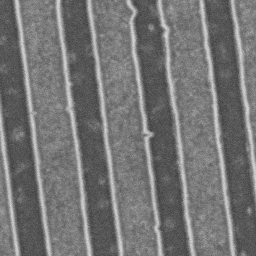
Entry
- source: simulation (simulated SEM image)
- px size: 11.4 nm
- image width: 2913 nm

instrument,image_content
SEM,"one or a few lines or trenches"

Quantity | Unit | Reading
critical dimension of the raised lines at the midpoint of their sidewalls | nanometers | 451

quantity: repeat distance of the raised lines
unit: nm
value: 812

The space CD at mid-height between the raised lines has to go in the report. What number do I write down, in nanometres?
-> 365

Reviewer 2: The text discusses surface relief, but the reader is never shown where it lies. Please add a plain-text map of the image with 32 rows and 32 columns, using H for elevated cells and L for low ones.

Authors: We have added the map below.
LLHHHHHLLLLHHHHHLLLLHHHHHLLLLHHH
LLHHHHHLLLLHHHHHHLLLHHHHHLLLLHHH
LLHHHHHLLLLHHHHHLLLLHHHHHLLLLHHH
LLLHHHHHLLLLHHHHLLLLLHHHHHLLLLHH
LLLHHHHHLLLLHHHHHLLLLHHHHHLLLLHH
LLLHHHHHLLLLHHHHHLLLLHHHHHLLLLHH
LLLHHHHHLLLLHHHHHLLLLHHHHHLLLLHH
LLLHHHHHLLLLHHHHHLLLLHHHHHLLLLHH
LLLHHHHHLLLLHHHHHLLLLHHHHHLLLLHH
LLLHHHHHLLLLHHHHHLLLLHHHHHLLLLHH
LLLHHHHHLLLLLHHHHLLLLHHHHHLLLLHH
LLLLHHHHHLLLLHHHHHLLLLHHHHHLLLLH
LLLLHHHHHLLLLHHHHHLLLLHHHHHLLLLH
LLLLHHHHHLLLLHHHHHLLLLHHHHHLLLLH
LLLLHHHHHLLLLHHHHHLLLLHHHHHLLLLH
LLLLHHHHHLLLLHHHHHLLLLHHHHHLLLLH
LLLLHHHHHLLLLHHHHHLLLLHHHHHLLLLH
LLLLHHHHHLLLLHHHHHLLLLHHHHHLLLLH
LLLLHHHHHHLLLHHHHHLLLLLHHHHLLLLL
LLLLLHHHHHLLLLHHHHHLLLLHHHHHLLLL
HLLLLHHHHHLLLLHHHHHLLLLHHHHHLLLL
HLLLLHHHHHLLLLHHHHHLLLLHHHHHLLLL
HLLLLHHHHHLLLLHHHHHLLLLHHHHHLLLL
HLLLLHHHHHLLLLHHHHHLLLLHHHHHLLLL
HLLLLHHHHHLLLLHHHHHLLLLHHHHHLLLL
HLLLLHHHHHLLLLHHHHHLLLLHHHHHLLLL
HLLLLHHHHHLLLLHHHHHLLLLHHHHHLLLL
HHLLLLHHHHHLLLLHHHHHLLLLHHHHHLLL
HHLLLLHHHHHLLLLHHHHHLLLLHHHHHLLL
HHLLLLHHHHHLLLLHHHHHLLLLHHHHHLLL
HHLLLLHHHHHLLLLHHHHHLLLLHHHHHLLL
HHLLLLHHHHHLLLLHHHHHLLLLHHHHHLLL